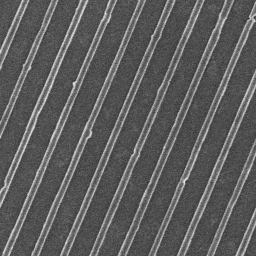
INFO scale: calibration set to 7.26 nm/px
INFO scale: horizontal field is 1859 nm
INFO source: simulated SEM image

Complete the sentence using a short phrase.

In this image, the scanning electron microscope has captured parallel lines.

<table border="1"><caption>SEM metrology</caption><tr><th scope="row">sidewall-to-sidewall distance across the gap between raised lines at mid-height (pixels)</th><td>20.9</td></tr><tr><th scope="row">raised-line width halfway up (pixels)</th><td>6.1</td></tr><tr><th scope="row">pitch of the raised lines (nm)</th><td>195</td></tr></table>